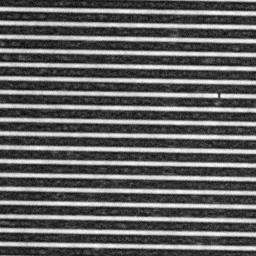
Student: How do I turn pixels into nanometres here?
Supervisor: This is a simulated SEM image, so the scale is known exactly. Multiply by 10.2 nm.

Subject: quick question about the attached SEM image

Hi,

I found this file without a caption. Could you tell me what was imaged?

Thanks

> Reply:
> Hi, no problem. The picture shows parallel lines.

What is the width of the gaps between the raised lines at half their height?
104 nm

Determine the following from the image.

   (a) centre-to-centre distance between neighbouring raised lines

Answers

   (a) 140 nanometres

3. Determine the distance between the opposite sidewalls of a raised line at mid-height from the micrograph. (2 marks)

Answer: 3.63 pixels